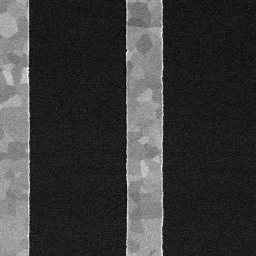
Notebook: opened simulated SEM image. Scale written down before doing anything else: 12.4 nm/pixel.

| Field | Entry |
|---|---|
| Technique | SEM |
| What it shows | one or a few lines or trenches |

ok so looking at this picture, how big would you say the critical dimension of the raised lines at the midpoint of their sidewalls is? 444 nm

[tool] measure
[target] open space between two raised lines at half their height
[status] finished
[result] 1220 nm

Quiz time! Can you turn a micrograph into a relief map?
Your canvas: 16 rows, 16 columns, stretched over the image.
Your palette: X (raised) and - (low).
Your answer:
XX------XX------
XX------XX------
XX------XX------
XX------XX------
XX------XX------
XX------XX------
XX------XX------
XX------XX------
XX------XX------
XX------XX------
XX------XX------
XX------XX------
XX------XX------
XX------XX------
XX------XX------
XX------XX------